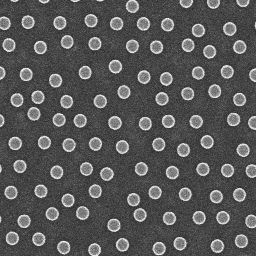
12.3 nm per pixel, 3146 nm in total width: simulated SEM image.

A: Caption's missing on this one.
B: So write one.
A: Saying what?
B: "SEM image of a regular array of raised bodies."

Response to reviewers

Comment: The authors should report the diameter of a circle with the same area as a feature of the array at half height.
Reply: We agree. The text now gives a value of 149 nanometres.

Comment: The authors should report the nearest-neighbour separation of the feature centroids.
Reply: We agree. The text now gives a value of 286 nm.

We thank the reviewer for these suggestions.